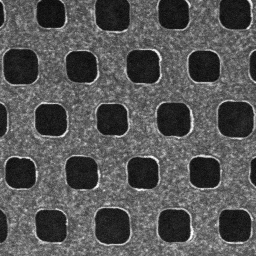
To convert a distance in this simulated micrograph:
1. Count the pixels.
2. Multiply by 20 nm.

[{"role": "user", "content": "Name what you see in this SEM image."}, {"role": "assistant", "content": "a regular array of holes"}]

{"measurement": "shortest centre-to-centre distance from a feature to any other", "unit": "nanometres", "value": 1220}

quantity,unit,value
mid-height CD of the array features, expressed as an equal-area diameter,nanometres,699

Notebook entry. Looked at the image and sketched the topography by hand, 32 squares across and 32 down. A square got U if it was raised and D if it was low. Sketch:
UUUUUDDDUUUUDDDDUUUUDDDUUUUDDDDU
DUUUDDDDUUUUDDDDUUUUDDDDUUUDDDDU
DUUUUDDDUUUUDDDDUUUUDDDDUUUDDDDU
UUUUUUDUUUUUDDDDUUUUUDDUUUUUDDDU
UUUUUUUUUUUUUUUUUUUUUUUUUUUUUUUU
UUUUUUUUUUUUUUUUUUUUUUUUUUUUUUUU
UDDDUUUUUDDUUUUUDDDUUUUUDDDUUUUU
DDDDDUUUDDDDUUUUDDDDUUUUDDDUUUUD
DDDDDUUUDDDDUUUUDDDDUUUDDDDDUUUD
UDDDDUUUDDDDUUUUDDDDUUUUDDDUUUUD
UDDDUUUUUUUUUUUUUUUUUUUUUUUUUUUU
UUUUUUUUUUUUUUUUUUUUUUUUUUUUUUUU
UUUUUUUUUUUUUUUUUUUUUUUUUUUUUUUU
DUUUUDDDUUUUDDDDUUUUDDDDUUUDDDDD
DUUUDDDDUUUUDDDDUUUUDDDDUUUDDDDD
DUUUDDDDUUUUDDDDUUUUDDDDUUUDDDDD
DUUUUDDDUUUUDDDDUUUUDDDDUUUDDDDU
UUUUUUUUUUUUUUUUUUUUUUUUUUUUUUUU
UUUUUUUUUUUUUUUUUUUUUUUUUUUUUUUU
UUUUUUUUUUUUUUUUUUUUUUUUUUUUUUUU
UDDDUUUUDDDDUUUUDDDDUUUUDDDUUUUD
UDDDDUUUDDDDUUUUDDDDUUUUDDDDUUUD
UDDDUUUUDDDDUUUUDDDDUUUUDDDUUUUD
UUDDUUUUUDDDUUUUUDDUUUUUUDUUUUUU
UUUUUUUUUUUUUUUUUUUUUUUUUUUUUUUU
UUUUUUUUUUUUUUUUUUUUUUUUUUUUUUUU
UUUUUDDDUUUUDDDDUUUUDDDUUUUUDDDU
DUUUDDDDUUUUDDDDUUUUDDDDUUUDDDDU
DUUUDDDDUUUUDDDDUUUUDDDDUUUDDDDU
DUUUUDDDUUUUDDDDUUUUDDDDUUUUDDDU
UUUUUUUUUUUUUDDUUUUUUUUUUUUUUUUU
UUUUUUUUUUUUUUUUUUUUUUUUUUUUUUUU